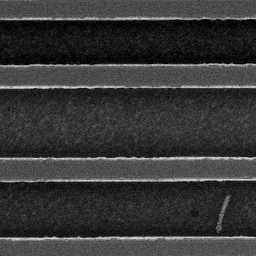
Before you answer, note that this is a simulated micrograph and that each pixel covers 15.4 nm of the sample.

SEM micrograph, lines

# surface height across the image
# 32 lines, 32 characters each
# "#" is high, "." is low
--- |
################################
################################
................................
................................
................................
................................
................................
................................
################################
################################
################################
................................
................................
................................
................................
................................
................................
................................
................................
................................
################################
################################
######################..........
................................
................................
................................
................................
................................
................................
................................
################################
################################